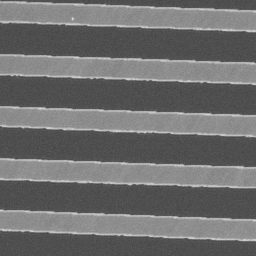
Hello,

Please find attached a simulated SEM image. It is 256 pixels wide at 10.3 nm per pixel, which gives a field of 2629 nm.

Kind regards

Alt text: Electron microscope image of lines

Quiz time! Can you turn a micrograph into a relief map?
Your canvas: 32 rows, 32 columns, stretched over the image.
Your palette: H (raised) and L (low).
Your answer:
HHHHHHHLLLLLLLLLLLLLLLLLLLLLLLLL
HHHHHHHHHHHHHHHHHHHHHHHHHHHHHHHH
HHHHHHHHHHHHHHHHHHHHHHHHHHHHHHHH
LLLLLLLLLLLLLLLLLLLLLHHHHHHHHHHH
LLLLLLLLLLLLLLLLLLLLLLLLLLLLLLLL
LLLLLLLLLLLLLLLLLLLLLLLLLLLLLLLL
LLLLLLLLLLLLLLLLLLLLLLLLLLLLLLLL
HHHHHHHHHHHHHHHHHHHHHLLLLLLLLLLL
HHHHHHHHHHHHHHHHHHHHHHHHHHHHHHHH
LLLLLHHHHHHHHHHHHHHHHHHHHHHHHHHH
LLLLLLLLLLLLLLLLLLLLLLLLLLLLLLLH
LLLLLLLLLLLLLLLLLLLLLLLLLLLLLLLL
LLLLLLLLLLLLLLLLLLLLLLLLLLLLLLLL
HHLLLLLLLLLLLLLLLLLLLLLLLLLLLLLL
HHHHHHHHHHHHHHHHHHHHHHHHHHHHHHHH
HHHHHHHHHHHHHHHHHHHHHHHHHHHHHHHH
LLLLLLLLLLLLLLLLLLHHHHHHHHHHHHHH
LLLLLLLLLLLLLLLLLLLLLLLLLLLLLLLL
LLLLLLLLLLLLLLLLLLLLLLLLLLLLLLLL
LLLLLLLLLLLLLLLLLLLLLLLLLLLLLLLL
HHHHHHHHHHHHHHHHHHHLLLLLLLLLLLLL
HHHHHHHHHHHHHHHHHHHHHHHHHHHHHHHH
LLLHHHHHHHHHHHHHHHHHHHHHHHHHHHHH
LLLLLLLLLLLLLLLLLLLLLLLLLLLLLLLL
LLLLLLLLLLLLLLLLLLLLLLLLLLLLLLLL
LLLLLLLLLLLLLLLLLLLLLLLLLLLLLLLL
HHHHLLLLLLLLLLLLLLLLLLLLLLLLLLLL
HHHHHHHHHHHHHHHHHHHHHHHHHHHHHHHH
HHHHHHHHHHHHHHHHHHHHHHHHHHHHHHHH
LLLLLLLLLLLLLLLLLLHHHHHHHHHHHHHH
LLLLLLLLLLLLLLLLLLLLLLLLLLLLLLLL
LLLLLLLLLLLLLLLLLLLLLLLLLLLLLLLL